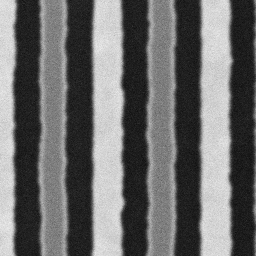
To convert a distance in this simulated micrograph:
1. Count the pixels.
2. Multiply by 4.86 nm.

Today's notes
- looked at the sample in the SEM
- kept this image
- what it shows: lines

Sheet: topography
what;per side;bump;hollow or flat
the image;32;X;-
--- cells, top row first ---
XX---XXX----XXX----XXX---XXXX---
XX---XXX----XXX----XXX---XXXX---
XX---XXX----XXX----XXX---XXXX---
XX---XXX----XXX----XXX---XXXX---
XX---XXX----XXX----XXX---XXXX---
XX---XXX----XXX---XXXX---XXXX---
XX---XXX----XXX---XXXX---XXXX---
XX---XXX----XXX----XXX---XXXX---
XX---XXX----XXX----XXX---XXXX---
XX---XXX----XXX----XXX---XXXX---
XX---XXX----XXX----XXX---XXXX---
XX---XXX----XXX----XXX---XXXX---
XX---XXX----XXX----XXX---XXXX---
XX---XXX----XXX---XXXX---XXXX---
XX---XXX----XXX---XXXX---XXXX---
XX---XXX----XXX---XXXX---XXXX---
XX---XXX----XXX---XXXX---XXXX---
XX---XXX----XXX---XXXX---XXXX---
XX---XXX----XXX----XXX---XXXX---
XX---XXX----XXX----XXX---XXXX---
XX---XXX----XXX----XXX---XXXX---
XX---XXX----XXX----XXX---XXXX---
XX---XXX----XXX---XXXX---XXXX---
XX---XXX----XXX----XXX---XXXX---
XX---XXX----XXX----XXX---XXXX---
XX---XXX----XXX----XXX---XXXX---
XX---XXX----XXX----XXX---XXXX---
XX---XXX----XXX---XXXX---XXXX---
XX---XXX----XXX----XXX---XXXX---
XX---XXX----XXX---XXXX---XXXX---
XX---XXX----XXX----XXX---XXXX---
XX---XXX----XXX---XXXX---XXXX---